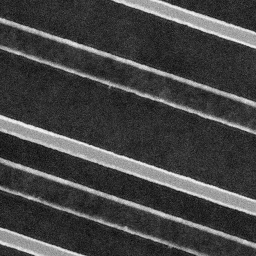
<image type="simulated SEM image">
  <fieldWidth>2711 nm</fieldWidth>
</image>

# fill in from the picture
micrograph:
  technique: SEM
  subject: lines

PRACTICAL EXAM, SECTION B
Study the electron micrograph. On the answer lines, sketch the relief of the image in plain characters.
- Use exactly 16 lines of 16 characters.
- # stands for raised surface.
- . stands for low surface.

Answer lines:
................
#...............
####............
.######.........
....######......
.......######...
..........######
.............###
................
................
##..............
#####...........
..######........
.....######.....
........######..
...........#####